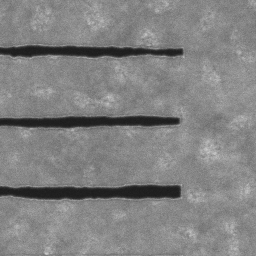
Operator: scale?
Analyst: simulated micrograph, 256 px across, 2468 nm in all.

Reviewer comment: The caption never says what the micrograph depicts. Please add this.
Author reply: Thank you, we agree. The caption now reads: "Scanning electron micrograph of one or a few lines or trenches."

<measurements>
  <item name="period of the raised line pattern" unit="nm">676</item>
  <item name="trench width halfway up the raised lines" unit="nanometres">558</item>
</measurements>